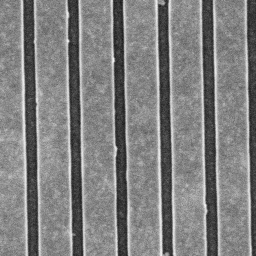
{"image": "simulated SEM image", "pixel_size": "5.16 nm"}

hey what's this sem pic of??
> parallel lines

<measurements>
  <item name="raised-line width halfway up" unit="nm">172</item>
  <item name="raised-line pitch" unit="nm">231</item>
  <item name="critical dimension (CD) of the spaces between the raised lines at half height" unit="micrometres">0.06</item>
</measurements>